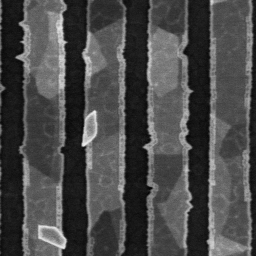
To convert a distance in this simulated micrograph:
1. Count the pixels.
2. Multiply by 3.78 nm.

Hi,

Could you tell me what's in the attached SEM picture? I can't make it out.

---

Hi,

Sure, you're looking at one or a few lines or trenches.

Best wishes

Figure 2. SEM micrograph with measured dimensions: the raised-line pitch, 0.235 µm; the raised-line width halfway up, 145 nanometres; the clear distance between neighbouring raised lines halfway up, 0.0917 microns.